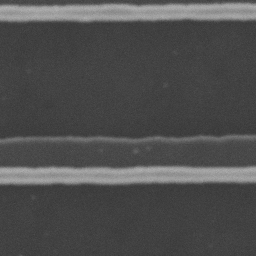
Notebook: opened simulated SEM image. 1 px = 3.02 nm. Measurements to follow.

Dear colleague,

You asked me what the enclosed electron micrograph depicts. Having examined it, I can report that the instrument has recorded lines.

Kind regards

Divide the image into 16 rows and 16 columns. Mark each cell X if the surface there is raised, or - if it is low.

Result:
XXXXXXXXXXXXXXXX
----------------
----------------
----------------
----------------
----------------
----------------
----------------
--------------XX
XXXXXXXXXXXXXXXX
XXXXXXXXXXXXXXXX
-X--------------
----------------
----------------
----------------
----------------